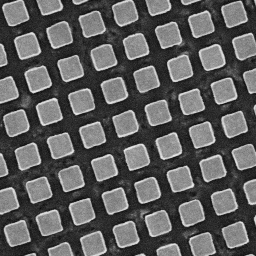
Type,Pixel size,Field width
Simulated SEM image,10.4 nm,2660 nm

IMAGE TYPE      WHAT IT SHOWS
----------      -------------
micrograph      a regular array of raised bodies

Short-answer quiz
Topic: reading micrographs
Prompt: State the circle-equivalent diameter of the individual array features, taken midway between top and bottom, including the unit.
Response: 0.256 micrometres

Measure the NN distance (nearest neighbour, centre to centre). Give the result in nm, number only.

355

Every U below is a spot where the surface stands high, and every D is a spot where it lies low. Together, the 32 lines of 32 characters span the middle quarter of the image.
UUUUDDDDUUUUDDDDDDDDDDDDDDUUUUUU
UUUUUDDDDDDDDDDDDDDUUUUDDDUUUUUU
UUUUUDDDDDDDDDDDDUUUUUUDDDUUUUUU
UUUDDDDDDDDDDDDDDDUUUUUDDDDUUUDD
DDDDDDDDDDUUUUUDDDUUUUUUDDDDDDDD
DDDDDDDDDUUUUUUDDDUUUUUUDDDDDDDD
DDDDUUDDDDUUUUUDDDDUUDDDDDDDDDDD
DDUUUUUDDDUUUUUUDDDDDDDDDDDDDUUU
DUUUUUUDDDUUUUUDDDDDDDDDDDDDDUUU
DDUUUUUDDDDUDDDDDDDDDDDUUDDDDUUU
DDUUUUUUDDDDDDDDDDDDDUUUUUDDDUUU
DDUUUUUDDDDDDDDDDDDDDUUUUUDDDDUU
DDDUDDDDDDDDDDUUUUDDDUUUUUUDDDUU
DDDDDDDDDDDDUUUUUUDDDUUUUUUDDDDD
DDDDDDDDDDDDUUUUUUDDDDUUUUDDDDDD
DDDDDUUUUDDDDUUUUUDDDDDDDDDDDDDD
DDDDUUUUUUDDDUUUUUDDDDDDDDDDDDDU
UDDDUUUUUUDDDUUUUDDDDDDDDDDUDDDU
UDDDUUUUUUDDDDDDDDDDDDDDUUUUUDDD
UUDDDUUUUUDDDDDDDDDDDDDUUUUUUDDD
UUDDDUUUDDDDDDDDDDUUDDDDUUUUUDDD
UUDDDDDDDDDDDDDUUUUUUDDDUUUUUDDD
UUDDDDDDDDDDDDDUUUUUUDDDUUUUUDDD
DDDDDDDDDUUUDDDUUUUUUDDDDUDDDDDD
DDDDDDDUUUUUDDDDUUUUUDDDDDDDDDDD
DDDDDDDUUUUUUDDDUUUUDDDDDDDDDDDD
UUUUDDDUUUUUUDDDDDDDDDDDDDDUUUUD
UUUUDDDDUUUUUDDDDDDDDDDDDDUUUUUU
UUUUUDDDUUUDDDDDDDDDDUDDDDUUUUUU
UUUUUDDDDDDDDDDDDDUUUUUDDDDUUUUU
UUUUUDDDDDDDDDDDDDUUUUUDDDDUUUUU
UUDDDDDDDDDDUUUDDDUUUUUUDDDUUUDD